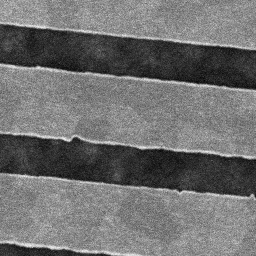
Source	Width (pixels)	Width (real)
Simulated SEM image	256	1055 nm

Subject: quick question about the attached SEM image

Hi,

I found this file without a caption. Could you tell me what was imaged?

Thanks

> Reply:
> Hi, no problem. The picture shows one or a few lines or trenches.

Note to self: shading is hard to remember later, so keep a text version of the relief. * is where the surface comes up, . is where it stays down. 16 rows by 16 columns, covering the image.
****************
.***************
...........*****
................
****............
**************..
****************
****************
..**************
.............***
................
*******.........
****************
****************
****************
....************